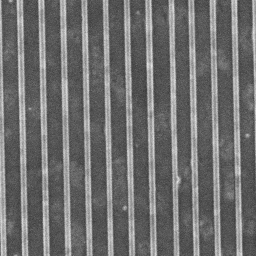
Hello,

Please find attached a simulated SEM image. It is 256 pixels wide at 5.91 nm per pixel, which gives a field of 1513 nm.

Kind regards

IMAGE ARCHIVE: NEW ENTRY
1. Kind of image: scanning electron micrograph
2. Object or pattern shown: parallel lines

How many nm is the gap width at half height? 96.8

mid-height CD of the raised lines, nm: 30.3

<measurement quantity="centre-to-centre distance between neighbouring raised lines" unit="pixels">21.4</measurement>